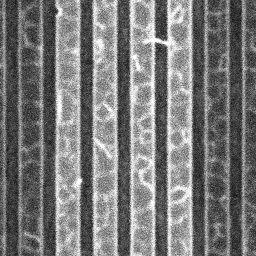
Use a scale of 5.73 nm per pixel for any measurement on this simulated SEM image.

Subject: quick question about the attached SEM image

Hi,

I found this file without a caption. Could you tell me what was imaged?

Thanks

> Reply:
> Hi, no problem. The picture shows parallel lines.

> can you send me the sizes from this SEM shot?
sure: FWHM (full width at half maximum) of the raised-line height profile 133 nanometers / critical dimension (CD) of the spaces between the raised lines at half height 83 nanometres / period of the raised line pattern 214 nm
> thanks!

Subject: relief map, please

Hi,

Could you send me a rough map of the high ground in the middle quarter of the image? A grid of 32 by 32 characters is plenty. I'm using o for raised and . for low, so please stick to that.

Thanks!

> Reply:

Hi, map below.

oooo....ooooo....ooooo....oooooo
oooo...oooooo....ooooo....oooooo
oooo...oooooo....ooooo....oooooo
oooo...oooooo....ooooo....oooooo
oooo...oooooo....ooooo....oooooo
oooo...oooooo....ooooo....oooooo
oooo...oooooo....ooooo....oooooo
oooo...oooooo....ooooo....oooooo
oooo...oooooo....ooooo....oooooo
oooo...oooooo....ooooo....oooooo
oooo...oooooo....ooooo....oooooo
oooo...oooooo....ooooo....oooooo
oooo...oooooo....ooooo....oooooo
oooo...oooooo....ooooo....oooooo
oooo...oooooo....ooooo....oooooo
oooo....ooooo....ooooo....oooooo
oooo....ooooo....ooooo....oooooo
oooo....ooooo....ooooo....oooooo
oooo....ooooo....ooooo....oooooo
oooo....ooooo....ooooo....oooooo
oooo....ooooo....ooooo....oooooo
oooo....ooooo....ooooo....oooooo
oooo....ooooo....ooooo....oooooo
oooo....ooooo....ooooo....oooooo
oooo....ooooo....ooooo....oooooo
oooo....ooooo....ooooo....oooooo
oooo....ooooo....ooooo....oooooo
oooo....ooooo....ooooo....oooooo
oooo....ooooo....ooooo....oooooo
oooo....ooooo....ooooo....oooooo
oooo....ooooo....ooooo....oooooo
oooo....ooooo....ooooo....oooooo